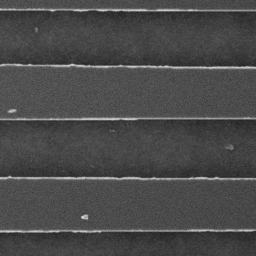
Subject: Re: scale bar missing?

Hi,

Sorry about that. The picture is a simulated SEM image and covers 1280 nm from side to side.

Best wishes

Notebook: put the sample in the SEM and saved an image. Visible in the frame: lines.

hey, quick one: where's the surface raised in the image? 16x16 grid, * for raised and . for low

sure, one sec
****************
................
................
................
****************
****************
****************
................
................
................
................
****************
****************
****************
................
................